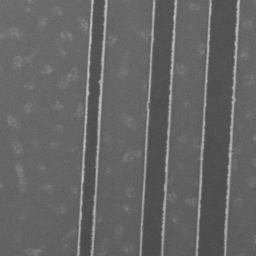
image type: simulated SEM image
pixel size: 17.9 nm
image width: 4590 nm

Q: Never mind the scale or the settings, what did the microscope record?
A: one or a few lines or trenches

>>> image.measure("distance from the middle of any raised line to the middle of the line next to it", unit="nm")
1120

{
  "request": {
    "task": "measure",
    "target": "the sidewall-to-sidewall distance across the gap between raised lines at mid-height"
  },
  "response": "733 nanometers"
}